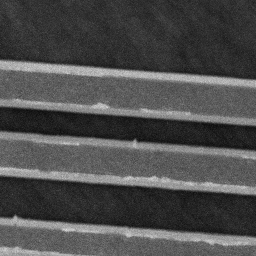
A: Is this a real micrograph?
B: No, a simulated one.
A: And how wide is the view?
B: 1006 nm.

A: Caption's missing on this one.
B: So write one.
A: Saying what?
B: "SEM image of one or a few lines or trenches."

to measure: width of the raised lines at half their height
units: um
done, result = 0.146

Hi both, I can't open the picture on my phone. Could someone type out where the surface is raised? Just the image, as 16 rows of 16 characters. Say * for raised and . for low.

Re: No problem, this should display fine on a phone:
................
................
................
................
******..........
****************
.***************
..............**
*...............
**************..
****************
..........******
................
................
*********.......
****************